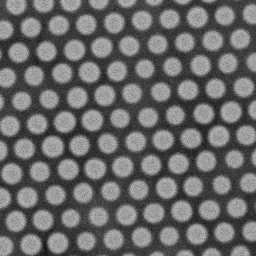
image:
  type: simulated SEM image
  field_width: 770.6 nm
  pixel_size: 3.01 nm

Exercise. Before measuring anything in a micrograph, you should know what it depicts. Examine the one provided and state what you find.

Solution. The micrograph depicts an array of small figures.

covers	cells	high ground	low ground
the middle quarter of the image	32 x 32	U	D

UDDDUUUUDDDUUUUDDDUUUUDDDUUUUDDD
UUDDUUUUUDDUUUUDDDUUUUDDDUUUUDDD
UUDDUUUUUDDUUUUDDDDUUUDDDDUUDDDD
UUDDUUUUDDDDUUUDDDDDDDDDDDDDDDDD
DDDDDDUDDDDDDDDDDDDDDDDDDDDDDDUU
DDDDDDDDDDDDDDDDUUDDDDDUUUDDDUUU
DDUUUDDDUUUUDDDUUUUDDDUUUUDDDUUU
DUUUUUDDUUUUDDDUUUUDDDUUUUDDDUUU
DUUUUUDDUUUUDDDUUUUDDDDUUUDDDDUU
DUUUUDDDUUUUDDDDUUDDDDDDDDDDDDDD
DDUUUDDDDDDDDDDDDDDDDDDDDDDDDDDD
DDDDDDDDDDDDDDDDDDDDUUDDDDUUUDDD
UUDDDUUUUDDDUUUUDDDUUUUDDDUUUUDD
UUUDDUUUUUDDUUUUDDDUUUUDDDUUUUDD
UUUDDUUUUUDDUUUUDDDUUUUDDDUUUDDD
UUDDDUUUUDDDDUUDDDDDUUDDDDDDDDDD
UUDDDDUUDDDDDDDDDDDDDDDDDDDDDDDU
DDDDDDDDDDDDDDDDDUUDDDDUUUUDDDUU
DDDUUDDDDUUUUDDDUUUUDDUUUUUDDUUU
DDUUUUDDDUUUUDDDUUUUDDDUUUUDDDUU
DDUUUUDDDUUUUDDDUUUUDDDUUUUDDDUU
DDUUUUDDDUUUUDDDDUUDDDDDDDDDDDDD
DDDUUDDDDDDDDDDDDDDDDDDDDDDDDDDD
DDDDDDDDDDDDDDUUDDDDUUUDDDDUUUUD
UUUDDDUUUUDDDUUUUDDDUUUUDDUUUUUD
UUUDDUUUUUDDUUUUUDDDUUUUDDUUUUUD
UUUDDUUUUUDDUUUUUDDDUUUUDDDUUUDD
UUUDDDUUUUDDDUUUDDDDDUDDDDDDDDDD
UUDDDDDUUDDDDDDDDDDDDDDDDDDDDDDD
DDDDDDDDDDDDDDDDDDUUDDDDUUUUDDUU
DDDUUUDDDDUUUDDDDUUUUDDUUUUUDDUU
DDDUUUUDDDUUUUDDUUUUUDDUUUUUDDUU